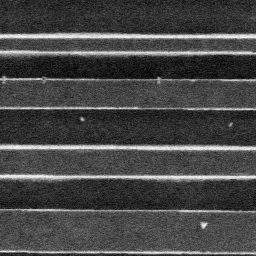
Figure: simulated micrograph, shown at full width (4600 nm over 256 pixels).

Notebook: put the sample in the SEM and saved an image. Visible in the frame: lines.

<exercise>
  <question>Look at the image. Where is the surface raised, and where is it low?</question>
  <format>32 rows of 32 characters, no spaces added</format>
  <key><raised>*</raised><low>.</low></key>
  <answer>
................................
................................
................................
................................
................................
********************************
*****..*.***********************
................................
................................
................................
********************************
********************************
********************************
...........*********************
................................
................................
................................
................................
**..............................
********************************
********************************
********************************
................................
................................
................................
................................
********************************
********************************
********************************
********************************
********************************
..............******************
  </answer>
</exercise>